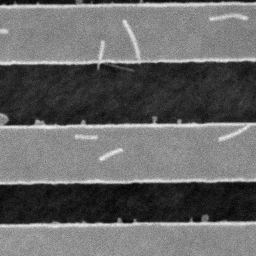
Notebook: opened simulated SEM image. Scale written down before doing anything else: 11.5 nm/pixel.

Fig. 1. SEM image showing lines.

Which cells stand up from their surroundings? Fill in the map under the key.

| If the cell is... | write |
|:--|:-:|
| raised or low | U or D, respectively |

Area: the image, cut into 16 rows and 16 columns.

UUUUUUUUUUUUUUUU
UUUUUUUUUUUUUUUU
UUUUUUUUUUUUUUUU
UUUUUUUUUUUUUUUU
DDDDDDDDDDDDDDDD
DDDDDDDDDDDDDDDD
DDDDDDDDDDDDDDDD
DDDDDDDDDDDDDDDD
UUUUUUUUUUUUUUUU
UUUUUUUUUUUUUUUU
UUUUUUUUUUUUUUUU
UUDDDDDDDDDDDDDD
DDDDDDDDDDDDDDDD
DDDDDDDDDDDDDDDD
UUUUUUUUUUUUUUUU
UUUUUUUUUUUUUUUU